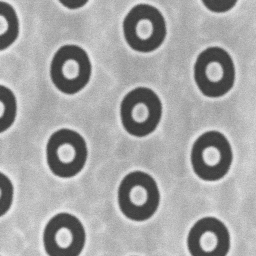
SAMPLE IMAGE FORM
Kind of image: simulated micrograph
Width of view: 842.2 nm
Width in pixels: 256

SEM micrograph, ring-shaped grooves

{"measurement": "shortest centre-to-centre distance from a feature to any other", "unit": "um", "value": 0.272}